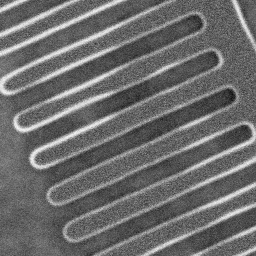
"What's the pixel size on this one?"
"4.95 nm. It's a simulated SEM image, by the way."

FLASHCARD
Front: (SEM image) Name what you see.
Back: groups of lines, slits or small figures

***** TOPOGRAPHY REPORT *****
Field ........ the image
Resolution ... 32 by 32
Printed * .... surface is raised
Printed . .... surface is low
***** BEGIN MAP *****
**......******......*********...
......******......************..
....******......******...*****..
..*****.......******.....******.
*****.......******......*******.
***.......******......**********
*......******......*******.*****
.....******......******.....****
...******......******......*****
.*****.......******......*******
****.......******......*********
.*.......*****......*******..***
......******......*******....***
....*****.......******......****
..*****.......******......******
..***.......******......******.*
..........******.....*******....
........*****......*******.....*
.....******......******......***
....*****......******......*****
....***......******......******.
..........*******......******...
........*******......*****......
.......*****......******.......*
......****......******.......***
.......*......******......******
...........*******......******..
.........*******......******....
........******.....*******......
........***......******.......**
...............******......*****
.............******......******.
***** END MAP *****